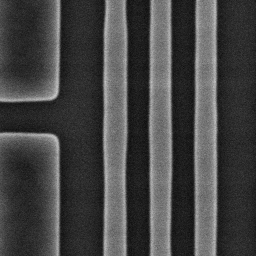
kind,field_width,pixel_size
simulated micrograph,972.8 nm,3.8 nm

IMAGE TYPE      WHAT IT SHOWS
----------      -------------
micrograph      wiring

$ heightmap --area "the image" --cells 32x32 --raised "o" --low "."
ooooooo......ooo...oo....oo.....
ooooooo......ooo...oo....oo.....
ooooooo......ooo...oo....oo.....
ooooooo......ooo...oo....oo.....
ooooooo......ooo...oo....oo.....
ooooooo......ooo...oo....oo.....
ooooooo......ooo...oo....oo.....
ooooooo......ooo...oo...ooo.....
ooooooo......ooo...oo...ooo.....
ooooooo......ooo...oo...ooo.....
ooooooo......ooo...oo...ooo.....
ooooooo......ooo...oo....oo.....
ooooo........ooo...oo...ooo.....
.............ooo...oo...ooo.....
.............ooo...oo...ooo.....
.............ooo...oo...ooo.....
.............ooo...oo...ooo.....
ooooooo......ooo...oo...ooo.....
ooooooo......ooo...oo...ooo.....
ooooooo......ooo...oo...ooo.....
ooooooo......ooo...oo...ooo.....
ooooooo......ooo...oo...ooo.....
ooooooo......ooo...oo...ooo.....
ooooooo......ooo...oo...ooo.....
ooooooo......ooo...oo...ooo.....
ooooooo......ooo...oo...ooo.....
ooooooo......ooo...oo...ooo.....
ooooooo......ooo...oo...ooo.....
ooooooo......ooo...oo...ooo.....
ooooooo......ooo...oo...ooo.....
ooooooo......ooo...oo...ooo.....
ooooooo......ooo...oo...ooo.....